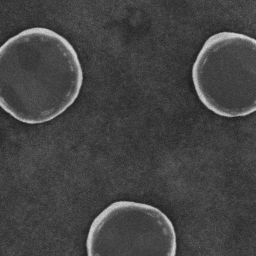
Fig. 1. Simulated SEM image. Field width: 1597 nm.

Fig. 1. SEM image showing raised bodies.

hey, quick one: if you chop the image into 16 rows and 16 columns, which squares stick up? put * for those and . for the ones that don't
................
................
.***.........***
*****.......****
*****.......****
*****.......****
****.........***
.**.............
................
................
................
................
................
......****......
......*****.....
......*****.....